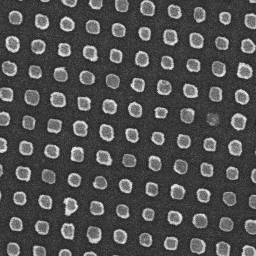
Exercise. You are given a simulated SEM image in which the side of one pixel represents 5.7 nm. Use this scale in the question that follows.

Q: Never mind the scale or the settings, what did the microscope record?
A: a regular array of raised bodies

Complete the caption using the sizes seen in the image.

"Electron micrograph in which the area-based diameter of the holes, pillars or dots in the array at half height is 0.0805 microns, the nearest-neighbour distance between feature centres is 0.144 microns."